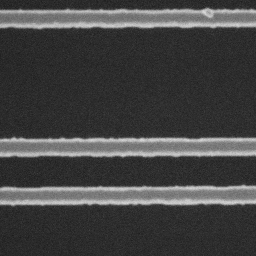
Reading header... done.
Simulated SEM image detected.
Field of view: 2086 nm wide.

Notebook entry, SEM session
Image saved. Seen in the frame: lines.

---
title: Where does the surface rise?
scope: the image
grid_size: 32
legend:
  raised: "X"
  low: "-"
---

--------------------------------
XXXXXXXXXXXXXXXXXXXXXXXXXXXXXXXX
XXXXXXXXXXXXXXXXXXXXXXXXXXXXXXXX
--------------------------------
--------------------------------
--------------------------------
--------------------------------
--------------------------------
--------------------------------
--------------------------------
--------------------------------
--------------------------------
--------------------------------
--------------------------------
--------------------------------
--------------------------------
--------------------------------
XXXXXXXXXXXXXXXXXXXXXXXXXXXXXXXX
XXXXXXXXXXXXXXXXXXXXXXXXXXXXXXXX
XX----------------X-------------
--------------------------------
--------------------------------
--------------------------------
-----XXXX--XXXXXXXXXXXXXXXXXXXXX
XXXXXXXXXXXXXXXXXXXXXXXXXXXXXXXX
XXXXXXXXXX----XX--X---X---------
--------------------------------
--------------------------------
--------------------------------
--------------------------------
--------------------------------
--------------------------------